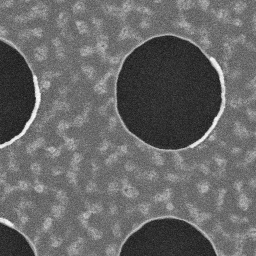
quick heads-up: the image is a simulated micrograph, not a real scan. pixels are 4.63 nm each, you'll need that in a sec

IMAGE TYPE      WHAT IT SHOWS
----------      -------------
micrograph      holes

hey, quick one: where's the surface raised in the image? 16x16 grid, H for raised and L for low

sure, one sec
HHHHHHHHHHHHHHHH
HHHHHHHHHHHHHHHH
HHHHHHHHHLLLHHHH
LHHHHHHHLLLLLHHH
LLHHHHHLLLLLLLHH
LLHHHHHLLLLLLLHH
LLHHHHHLLLLLLLHH
LLHHHHHHLLLLLHHH
LHHHHHHHLLLLLHHH
HHHHHHHHHHHHHHHH
HHHHHHHHHHHHHHHH
HHHHHHHHHHHHHHHH
HHHHHHHHHHHHHHHH
HHHHHHHHHHHHHHHH
LHHHHHHHLLLLLHHH
LLHHHHHHLLLLLHHH